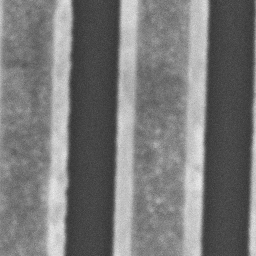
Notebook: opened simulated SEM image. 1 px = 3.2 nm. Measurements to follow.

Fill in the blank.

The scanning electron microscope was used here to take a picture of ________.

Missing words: one or a few lines or trenches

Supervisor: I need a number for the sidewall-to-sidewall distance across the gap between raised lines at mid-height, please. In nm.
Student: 198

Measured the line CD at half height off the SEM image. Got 0.237 microns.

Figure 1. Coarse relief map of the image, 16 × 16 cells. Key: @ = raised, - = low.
@@@@----@@@@@---
@@@@----@@@@@---
@@@@----@@@@@---
@@@@----@@@@@---
@@@@----@@@@----
@@@@----@@@@----
@@@@----@@@@----
@@@@----@@@@----
@@@@----@@@@----
@@@@----@@@@----
@@@@----@@@@----
@@@@----@@@@----
@@@@----@@@@----
@@@@----@@@@----
@@@@----@@@@----
@@@@----@@@@----